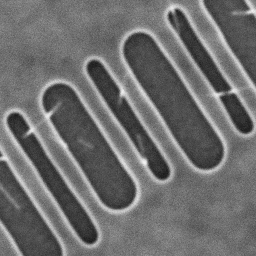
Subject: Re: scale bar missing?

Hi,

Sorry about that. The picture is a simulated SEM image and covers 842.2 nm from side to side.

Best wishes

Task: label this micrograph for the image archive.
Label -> groups of lines, slits or small figures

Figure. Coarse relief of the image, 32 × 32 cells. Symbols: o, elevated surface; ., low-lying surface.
ooooooooooooooooooooooooo......o
ooooooooooooooooooooo..ooo.....o
ooooooooooooooooooooo..oooo.....
oooooooooooooooooooooo..ooo.....
oooooooooooooooo...ooo...ooo....
ooooooooooooooo.....ooo..ooo....
ooooooooooooooo.....ooo...ooo...
oooooooooooooooo.....ooo...ooo..
ooooooooooo..ooo......ooo..ooo..
ooooooooooo...ooo......ooo..ooo.
ooooooo.oooo...oo......ooo...ooo
oooooo...ooo...ooo......ooo..ooo
ooooo.....ooo...ooo.....oooo..oo
ooooo......ooo..ooo......ooo...o
o..ooo.....ooo...ooo......ooo..o
o..oooo.....ooo...ooo.....ooo...
o...ooo......ooo..ooo......ooo.o
oo...ooo.....ooo...ooo......oooo
ooo..ooo......ooo...ooo.....oooo
ooo...ooo......ooo..ooo.....oooo
.ooo...ooo.....ooo...ooo...ooooo
..ooo..ooo......ooo..ooooooooooo
..ooo...ooo......ooo.ooooooooooo
...ooo...oo......ooooooooooooooo
....ooo..ooo.....ooooooooooooooo
....ooo...ooo...oooooooooooooooo
.....ooo...ooooooooooooooooooooo
......oo...ooooooooooooooooooooo
o.....ooo...oooooooooooooooooooo
o......ooo..oooooooooooooooooooo
oo.....oooo.oooooooooooooooooooo
ooo.....oooooooooooooooooooooooo